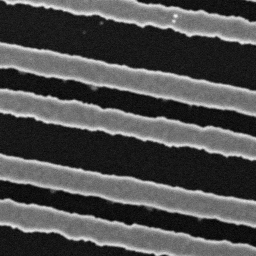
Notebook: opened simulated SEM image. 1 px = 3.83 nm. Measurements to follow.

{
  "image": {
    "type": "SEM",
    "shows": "lines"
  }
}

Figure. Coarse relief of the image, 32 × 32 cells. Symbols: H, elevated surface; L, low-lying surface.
LLLHHHHHHHHHHHHHHHHLLLLLLLLLLLLL
LLLLLLLLLHHHHHHHHHHHHHHHHHLLLLLL
LLLLLLLLLLLLLLHHHHHHHHHHHHHHHHHL
LLLLLLLLLLLLLLLLLLLLHHHHHHHHHHHH
LLLLLLLLLLLLLLLLLLLLLLLLLLHHHHHH
HLLLLLLLLLLLLLLLLLLLLLLLLLLLLLHH
HHHHHHHLLLLLLLLLLLLLLLLLLLLLLLLL
HHHHHHHHHHHHLLLLLLLLLLLLLLLLLLLL
HHHHHHHHHHHHHHHHLLLLLLLLLLLLLLLL
LLLLLHHHHHHHHHHHHHHHHHHLLLLLLLLL
LLLLLLLLLLLHHHHHHHHHHHHHHHHHLLLL
HHHLLLLLLLLLLLLLHHHHHHHHHHHHHHHH
HHHHHHHHLLLLLLLLLLLLLLHHHHHHHHHH
HHHHHHHHHHHHHLLLLLLLLLLLLLLHHHHH
LLHHHHHHHHHHHHHHHHLLLLLLLLLLLLLH
LLLLLLLHHHHHHHHHHHHHHHHHLLLLLLLL
LLLLLLLLLLLLLHHHHHHHHHHHHHHHHLLL
LLLLLLLLLLLLLLLLLLHHHHHHHHHHHHHH
LLLLLLLLLLLLLLLLLLLLLLLLHHHHHHHH
HLLLLLLLLLLLLLLLLLLLLLLLLLLLHHHH
HHHHHHHLLLLLLLLLLLLLLLLLLLLLLLLL
HHHHHHHHHHHHLLLLLLLLLLLLLLLLLLLL
HHHHHHHHHHHHHHHHHHLLLLLLLLLLLLLL
LLLLLLHHHHHHHHHHHHHHHHHLLLLLLLLL
LLLLLLLLLLLLHHHHHHHHHHHHHHHLLLLL
HHHLLLLLLLLLLLLLHHHHHHHHHHHHHHHH
HHHHHHHHLLLLLLLLLLLLLHHHHHHHHHHH
HHHHHHHHHHHHHLLLLLLLLLLLLLLHHHHH
LLHHHHHHHHHHHHHHHHHLLLLLLLLLLLLL
LLLLLLLLHHHHHHHHHHHHHHHHLLLLLLLL
LLLLLLLLLLLLHHHHHHHHHHHHHHHHHHLL
LLLLLLLLLLLLLLLLLHHHHHHHHHHHHHHH